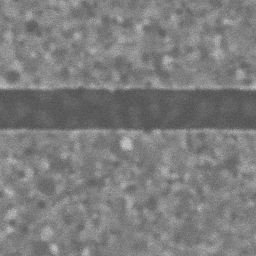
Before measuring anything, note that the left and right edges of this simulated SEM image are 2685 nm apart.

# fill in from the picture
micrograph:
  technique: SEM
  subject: one or a few lines or trenches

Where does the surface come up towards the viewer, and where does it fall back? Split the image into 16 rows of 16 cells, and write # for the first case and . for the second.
################
################
################
################
################
..#.......###..#
................
................
################
################
################
################
################
################
################
################